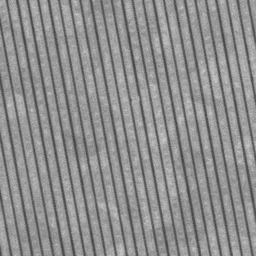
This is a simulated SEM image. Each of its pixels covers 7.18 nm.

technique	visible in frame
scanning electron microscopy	parallel lines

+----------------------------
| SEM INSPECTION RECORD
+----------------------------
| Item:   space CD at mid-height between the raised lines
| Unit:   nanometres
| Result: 19.5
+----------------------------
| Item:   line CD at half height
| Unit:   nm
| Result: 51.2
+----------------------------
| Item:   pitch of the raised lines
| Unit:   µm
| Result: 0.0741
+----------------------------